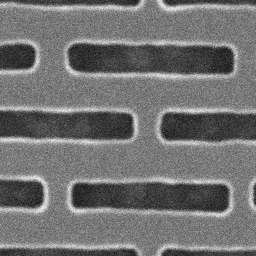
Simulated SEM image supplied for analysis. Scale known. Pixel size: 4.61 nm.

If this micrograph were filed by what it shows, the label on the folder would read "holes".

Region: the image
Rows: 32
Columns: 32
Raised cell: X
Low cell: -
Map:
X----------------XXX------------
XXXXXXXXXXXXXXXXXXXXXXXXXXXXXXXX
XXXXXXXXXXXXXXXXXXXXXXXXXXXXXXXX
XXXXXXXXXXXXXXXXXXXXXXXXXXXXXXXX
XXXXXXXXXXXXXXXXXXXXXXXXXXXXXXXX
X---XXXXX---X---XX------XXXXXXXX
----XXXX---------------------XXX
----XXXX---------------------XXX
----XXXXX--------------------XXX
XXXXXXXXXXXXXXXXXXXXXXXXXXXXXXXX
XXXXXXXXXXXXXXXXXXXXXXXXXXXXXXXX
XXXXXXXXXXXXXXXXXXXXXXXXXXXXXXXX
XXXXXXXXXXXXXXXXXXXXXXXXXXXXXXXX
XXXXXXXXXXXXXXXXXXXXXXXXXXXXXXXX
-----------------XXX------------
-----------------XXX------------
-----------------XXX------------
XXXXXXXXX-------XXXX------------
XXXXXXXXXXXXXXXXXXXXXXXXXXXXXXXX
XXXXXXXXXXXXXXXXXXXXXXXXXXXXXXXX
XXXXXXXXXXXXXXXXXXXXXXXXXXXXXXXX
XXXXXXXXXXXXXXXXXXXXXXXXXXXXXXXX
---XXXXXXXXXXXXXXXXXXXXXXXXXXXXX
-----XXXX--------------------XXX
------XXX--------------------XX-
------XXX--------------------XXX
XXXXXXXXXXXXXXXXXXXXXXXX----XXXX
XXXXXXXXXXXXXXXXXXXXXXXXXXXXXXXX
XXXXXXXXXXXXXXXXXXXXXXXXXXXXXXXX
XXXXXXXXXXXXXXXXXXXXXXXXXXXXXXXX
XXXXXXXXXXXXXXXXXXXXXXXXXXXXXXXX
-----------------XXX------------